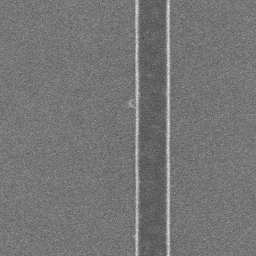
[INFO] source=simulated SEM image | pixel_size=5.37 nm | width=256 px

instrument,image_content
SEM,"one or a few lines or trenches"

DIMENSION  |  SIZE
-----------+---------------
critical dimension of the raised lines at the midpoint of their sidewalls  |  176 nm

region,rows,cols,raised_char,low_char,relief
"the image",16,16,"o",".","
.........oo.....
.........oo.....
.........oo.....
.........oo.....
.........oo.....
.........oo.....
.........oo.....
.........oo.....
.........oo.....
.........oo.....
.........oo.....
.........oo.....
.........oo.....
.........oo.....
.........oo.....
.........oo.....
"